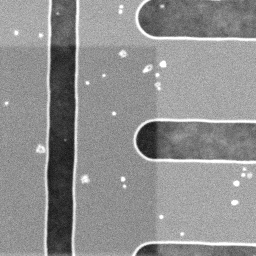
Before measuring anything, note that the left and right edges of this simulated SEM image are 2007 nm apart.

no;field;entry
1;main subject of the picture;groups of lines, slits or small figures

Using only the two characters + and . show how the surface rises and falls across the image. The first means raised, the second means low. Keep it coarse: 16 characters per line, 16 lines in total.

+++..++++.......
+++..++++.......
+++..+++++++++++
+++..+++++++++++
+++..+++++++++++
+++..+++++++++++
+++..+++++++++++
+++..+++++++++++
+++..++++.......
+++..++++.......
+++..+++++++++++
+++..+++++++++++
+++..+++++++++++
+++..+++++++++++
+++..+++++++++++
+++..++++.......